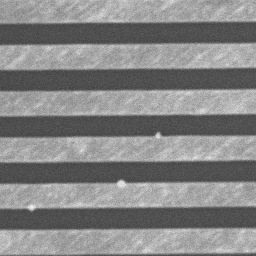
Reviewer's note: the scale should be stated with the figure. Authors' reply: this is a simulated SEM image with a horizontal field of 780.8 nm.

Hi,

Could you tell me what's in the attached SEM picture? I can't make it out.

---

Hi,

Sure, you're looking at wiring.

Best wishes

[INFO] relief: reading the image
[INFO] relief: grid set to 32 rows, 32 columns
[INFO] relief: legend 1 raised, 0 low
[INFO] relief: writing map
11111111111111111111111111111111
11111111111111111111111111111111
11111111111111111111111111111111
00000000000000000000000000000000
00000000000000000000000000000000
00000000000000000000000000000000
11111111111111111111111111111111
11111111111111111111111111111111
11111111111111110000000000000000
00000000000000000000000000000000
00000000000000000000000000000000
00011101111111111111111111111111
11111111111111111111111111111111
11111111111111111111111111111111
00000000000000000000000000000000
00000000000000000000000000000000
00000000000000000000000000000000
11111111111111111111111111111111
11111111111111111111111111111111
11111111111111111111111111111111
00000000000000000000000000000000
00000000000000000000000000000000
00000000000000000000000000000000
11111111111111111111111111111111
11111111111111111111111111111111
11111111111111111111111111111111
00000000000000000000000000000000
00000000000000000000000000000000
00000000000000000000000000000000
11111111111111111111111111111111
11111111111111111111111111111111
11111111111111111111111111111111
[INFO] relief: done